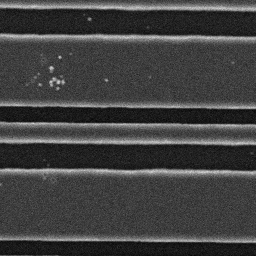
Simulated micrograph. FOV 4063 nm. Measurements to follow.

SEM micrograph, lines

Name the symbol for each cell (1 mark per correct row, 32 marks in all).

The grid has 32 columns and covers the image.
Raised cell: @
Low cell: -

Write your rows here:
@@@@@@@@@@@@@@@@@@@@@@@@@@@@@@@@
--------------------------------
--------------------------------
--------------------------------
@@@@@--@------------------------
@@@@@@@@@@@@@@@@@@@@@@@@@@@@@@@@
@@@@@@@@@@@@@@@@@@@@@@@@@@@@@@@@
@@@@@@@@@@@@@@@@@@@@@@@@@@@@@@@@
@@@@@@@@@@@@@@@@@@@@@@@@@@@@@@@@
@@@@@@@@@@@@@@@@@@@@@@@@@@@@@@@@
@@@@@@@@@@@@@@@@@@@@@@@@@@@@@@@@
@@@@@@@@@@@@@@@@@@@@@@@@@@@@@@@@
@@@@@@@@@@@@@@@@@@@@@@@@@@@@@@@@
----------------------------@@@@
--------------------------------
@@@@@@@@@@@@@@@@@@@@@@@---------
@@@@@@@@@@@@@@@@@@@@@@@@@@@@@@@@
@@@@@@@@@@@@@@@@@@@@@@@@@@@@@@@@
--------------------------------
--------------------------------
--------------------------------
@@@@@@@@@@@@@@@@@@@@@@@@@@@@@@--
@@@@@@@@@@@@@@@@@@@@@@@@@@@@@@@@
@@@@@@@@@@@@@@@@@@@@@@@@@@@@@@@@
@@@@@@@@@@@@@@@@@@@@@@@@@@@@@@@@
@@@@@@@@@@@@@@@@@@@@@@@@@@@@@@@@
@@@@@@@@@@@@@@@@@@@@@@@@@@@@@@@@
@@@@@@@@@@@@@@@@@@@@@@@@@@@@@@@@
@@@@@@@@@@@@@@@@@@@@@@@@@@@@@@@@
@@@@@@@@@@@@@@@@@@@@@@@@@@@@@@@@
--------------------------------
--------------------------------